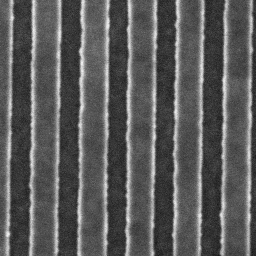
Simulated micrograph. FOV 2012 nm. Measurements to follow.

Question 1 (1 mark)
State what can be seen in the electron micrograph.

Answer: lines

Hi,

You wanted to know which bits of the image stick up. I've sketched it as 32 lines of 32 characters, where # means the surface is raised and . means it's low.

##..####..####..####..###...###.
#...####..####..####..###...###.
##..####..####..####..###...###.
#...####..####..####..###...###.
#...####..####..####..###...###.
#...####..###...####..###...###.
#...###...###...####..###...###.
#...###...###...###...###...###.
#...###...###...###...###...###.
#...###...###...###...###...###.
#...###...###...###...###...###.
#...###...###...###...###...###.
#...###...###...###...###...###.
#...###...###...###...###...###.
#...###...###...###...###...###.
#...###...###...###...###...###.
#...###...###...###...###...###.
#...###...###...###...###...###.
#...###...###...###...###...###.
#...###...###...###...###...###.
#...###...###...###...###...###.
#...###...###...###...###...###.
#...###...###...###...###...###.
#...###...###...###...###...###.
#...###...###...###...###...###.
#...###...###...###...###...###.
#...###...###...###...###...###.
#...###...###...###...###...###.
#...###...###...###...###...###.
#...###...###...###...###...###.
#...###...###...###...###...###.
#...###...###...###...###...###.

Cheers